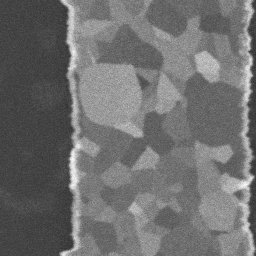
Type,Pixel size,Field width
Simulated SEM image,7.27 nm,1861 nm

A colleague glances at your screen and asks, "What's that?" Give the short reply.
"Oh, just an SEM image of one or a few lines or trenches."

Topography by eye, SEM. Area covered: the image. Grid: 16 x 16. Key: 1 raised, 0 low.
0000111111111111
0000111111111111
0000111111111111
0000011111111111
0000111111111111
0000011111111110
0000011111111110
0000011111111110
0000011111111110
0000011111111111
0000011111111110
0000011111111110
0000011111111110
0000011111111110
0000011111111111
0000011111111111